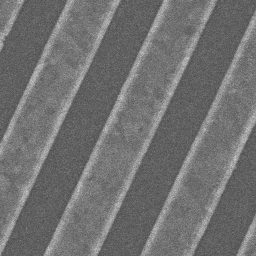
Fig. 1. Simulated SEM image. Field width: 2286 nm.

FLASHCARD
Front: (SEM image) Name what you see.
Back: one or a few lines or trenches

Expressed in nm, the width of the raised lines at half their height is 369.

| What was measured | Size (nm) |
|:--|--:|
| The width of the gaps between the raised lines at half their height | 409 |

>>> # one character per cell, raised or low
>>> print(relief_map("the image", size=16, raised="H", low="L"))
HLLLHHHLLLHHHLLL
HLLLHHHLLLHHHLLL
LLLHHHLLLHHHLLLH
LLLHHHLLLHHHLLLH
LLHHHLLLHHHLLLHH
LLHHHLLLHHHLLLHH
LHHHLLLHHHLLLHHH
LHHHLLLHHHLLLHHH
HHHLLLHHHLLLLHHL
HHHLLLHHHLLLHHHL
HHLLLLHHLLLLHHLL
HHLLLHHHLLLHHHLL
HLLLLHHLLLLHHLLL
HLLLHHHLLLHHHLLL
LLLLHHHLLLHHHLLL
LLLHHHLLLHHHLLLH